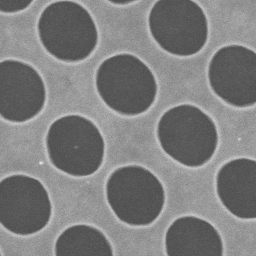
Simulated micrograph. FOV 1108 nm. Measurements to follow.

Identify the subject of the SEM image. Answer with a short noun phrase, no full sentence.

holes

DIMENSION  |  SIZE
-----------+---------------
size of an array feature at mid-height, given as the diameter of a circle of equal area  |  59.5 pixels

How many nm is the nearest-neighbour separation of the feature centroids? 340